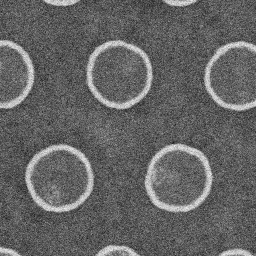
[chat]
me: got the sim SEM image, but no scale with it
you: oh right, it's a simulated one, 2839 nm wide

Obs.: raised bodies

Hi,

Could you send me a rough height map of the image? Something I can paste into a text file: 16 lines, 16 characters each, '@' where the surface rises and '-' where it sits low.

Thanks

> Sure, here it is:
----------------
----------------
----------------
@@----@@@-----@@
@@----@@@----@@@
@@----@@@----@@@
@------@------@@
----------------
----------------
---@@-----@@----
--@@@@---@@@@---
--@@@@---@@@@---
--@@@-----@@----
----------------
----------------
----------------